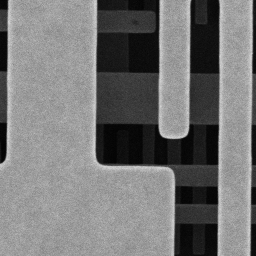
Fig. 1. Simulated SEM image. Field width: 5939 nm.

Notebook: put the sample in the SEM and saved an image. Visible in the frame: wiring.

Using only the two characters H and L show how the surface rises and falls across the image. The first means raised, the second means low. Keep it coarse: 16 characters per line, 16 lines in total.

HHHHHHLLLLHHLLHH
HHHHHHLLLLHHLLHH
HHHHHHLLLLHHLLHH
HHHHHHLLLLHHLLHH
HHHHHHLLLLHHLLHH
HHHHHHLLLLHHLLHH
HHHHHHLLLLHHLLHH
HHHHHHLLLLHHLLHH
HHHHHHLLLLHLLLHH
HHHHHHLLLLLLLLHH
HHHHHHHHHHLLLLHH
HHHHHHHHHHHLLLHH
HHHHHHHHHHHLLLHH
HHHHHHHHHHHLLLHH
HHHHHHHHHHHLLLHH
HHHHHHHHHHHLLLHH